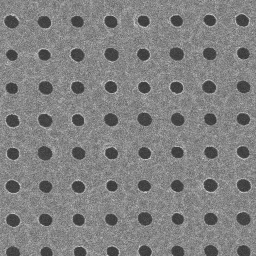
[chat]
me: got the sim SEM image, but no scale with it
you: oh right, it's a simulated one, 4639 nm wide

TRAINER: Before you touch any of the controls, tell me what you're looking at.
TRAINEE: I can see a regular array of holes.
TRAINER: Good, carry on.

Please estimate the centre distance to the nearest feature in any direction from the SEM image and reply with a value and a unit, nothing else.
591 nm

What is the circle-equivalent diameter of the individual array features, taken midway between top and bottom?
237 nm